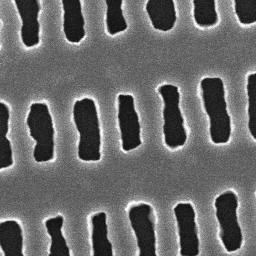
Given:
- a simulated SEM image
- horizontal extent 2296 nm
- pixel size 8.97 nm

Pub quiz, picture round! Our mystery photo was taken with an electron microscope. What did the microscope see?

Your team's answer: holes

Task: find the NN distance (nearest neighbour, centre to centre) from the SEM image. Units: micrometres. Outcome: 0.398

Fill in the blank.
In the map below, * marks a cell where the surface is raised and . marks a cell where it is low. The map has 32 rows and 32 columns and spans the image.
**...***..***..***....**...**...
**...***..***..***....**...**...
***..***...**...***...**...***..
***..***..***...***..***********
***..***..**********************
***..***************************
********************************
********************************
********************************
*******************************.
*************************...***.
********************..***...***.
**********.****..***..***...***.
.***..***...***..***..****..***.
.**...***...***..***...***...**.
.**....**...***..***...***...**.
.***...***..***...**...***...**.
.***...***...**...***..****.****
.***...***..***..***************
..**...***...*******************
.*******************************
********************************
********************************
********************************
***************************...**
**********************..***...**
****************...***..***...**
******..****.***...***..***...**
...***..****.****..***...**...**
...***..****.****..***...**...**
...***..****..***..****..***..**
...***...***..***..****..*******